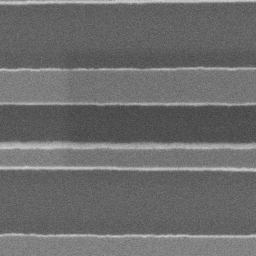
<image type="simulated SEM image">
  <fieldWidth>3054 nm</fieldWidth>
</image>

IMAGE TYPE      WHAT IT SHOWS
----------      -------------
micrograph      lines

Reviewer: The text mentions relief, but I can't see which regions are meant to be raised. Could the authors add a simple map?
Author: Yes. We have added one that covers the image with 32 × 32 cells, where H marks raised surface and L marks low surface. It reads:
LLLLLLLLLLLLLLLLLLLLLLLLLLLLLLLL
LLLLLLLLLLLLLLLLLLLLLLLLLLLLLLLL
LLLLLLLLLLLLLLLLLLLLLLLLLLLLLLLL
LLLLLLLLLLLLLLLLLLLLLLLLLLLLLLLL
LLLLLLLLLLLLLLLLLLLLLLLLLLLLLLLL
LLLLLLLLLLLLLLLLLLLLLLLLLLLLLLLL
LLLLLLLLLLLLLLLLLLLLLLLLLLLLLLLL
LLLLLLLLLLLLLLLLLLLLLLLLLLLLLLLL
LLLLLLLLLLLLLLLLLLLLLLLLLLLLLLLL
HHHHHHHHHHHHHHHHHHHHHHHHHHHHHHHH
HHHHHHHHHHHHHHHHHHHHHHHHHHHHHHHH
HHHHHHHHHHHHHHHHHHHHHHHHHHHHHHHH
HHHHHHHHHHHHHHHHHHHHHHHHHHHHHHHH
LLLLLLLLLLLLLLLLLLLLLLLLLLLLLLLL
LLLLLLLLLLLLLLLLLLLLLLLLLLLLLLLL
LLLLLLLLLLLLLLLLLLLLLLLLLLLLLLLL
LLLLLLLLLLLLLLLLLLLLLLLLLLLLLLLL
LLLLLLLLLLLLLLLLLLLLLLLLLLLLLLLL
HHHHHHHHHHHHHHHHHHHHHHHHHHHHHHHH
HHHHHHHHHHHHHHHHHHHHHHHHHHHHHHHH
HHHHHHHHHHHHHHHHHHHHHHHHHHHHHHHH
LLLLLLLLLLLLLLLLLLLLLLLLLLLLLLLL
LLLLLLLLLLLLLLLLLLLLLLLLLLLLLLLL
LLLLLLLLLLLLLLLLLLLLLLLLLLLLLLLL
LLLLLLLLLLLLLLLLLLLLLLLLLLLLLLLL
LLLLLLLLLLLLLLLLLLLLLLLLLLLLLLLL
LLLLLLLLLLLLLLLLLLLLLLLLLLLLLLLL
LLLLLLLLLLLLLLLLLLLLLLLLLLLLLLLL
LLLLLLLLLLLLLLLLLLLLLLLLLLLLLLLL
HHHHHLLLHHHHLLLLLLLLLLLLLLLLLLLL
HHHHHHHHHHHHHHHHHHHHHHHHHHHHHHHH
HHHHHHHHHHHHHHHHHHHHHHHHHHHHHHHH